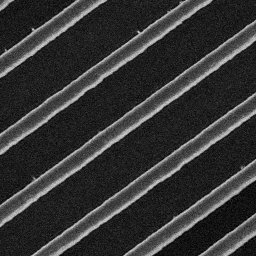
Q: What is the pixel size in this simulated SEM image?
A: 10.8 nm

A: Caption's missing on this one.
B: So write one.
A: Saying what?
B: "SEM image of lines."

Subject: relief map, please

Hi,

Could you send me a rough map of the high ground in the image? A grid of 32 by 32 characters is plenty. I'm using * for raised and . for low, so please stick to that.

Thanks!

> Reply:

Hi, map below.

*........****..........***......
........***..........***........
......****..........***.........
.....****.........****.........*
....***..........***.........***
..****..........***.........***.
.****.........****........****..
***..........***.........****...
**..........***.........***.....
..........***.........****......
.........***.........***........
.......****.........***.........
......****........****.........*
.....***.........***.........***
...****........****.........****
..***.........****.........***..
****.........***.........****...
***........****.........***.....
*.........****........****......
.........***.........****.......
.......****.........***........*
......***.........****........**
....****.........***........****
...****.........***........***..
..***.........****........***...
****.........***........****....
***........****........***......
*.........****.......****......*
.........***........****......**
.......****........***......****
......***........****......***..
.....***........****.....****...